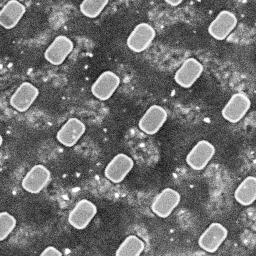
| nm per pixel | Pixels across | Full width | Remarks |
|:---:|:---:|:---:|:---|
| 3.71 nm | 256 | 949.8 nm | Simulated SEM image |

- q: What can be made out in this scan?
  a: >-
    a regular array of raised bodies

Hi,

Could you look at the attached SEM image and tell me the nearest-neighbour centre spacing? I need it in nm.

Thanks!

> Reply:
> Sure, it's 216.